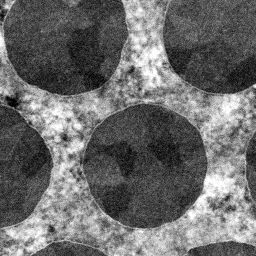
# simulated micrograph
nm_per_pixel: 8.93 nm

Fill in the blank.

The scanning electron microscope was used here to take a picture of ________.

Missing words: raised bodies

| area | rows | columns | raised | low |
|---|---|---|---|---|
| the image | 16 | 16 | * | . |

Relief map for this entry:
.*******..******
********..******
********..******
********..******
.******....*****
..****......****
.........*......
**....******....
***...*******...
***..********..*
***..********..*
***..********..*
***...******....
**.....****.....
................
...***......****